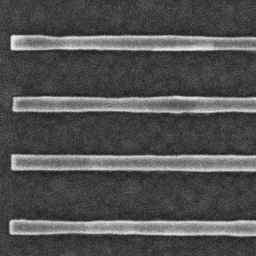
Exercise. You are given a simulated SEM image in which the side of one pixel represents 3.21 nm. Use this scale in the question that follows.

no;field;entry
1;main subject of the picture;one or a few lines or trenches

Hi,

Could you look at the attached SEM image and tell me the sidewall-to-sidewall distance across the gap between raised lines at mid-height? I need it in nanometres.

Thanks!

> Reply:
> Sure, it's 156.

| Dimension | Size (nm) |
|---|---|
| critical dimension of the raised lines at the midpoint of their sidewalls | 42.5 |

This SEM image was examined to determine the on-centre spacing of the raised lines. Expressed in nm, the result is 198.